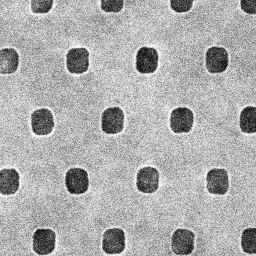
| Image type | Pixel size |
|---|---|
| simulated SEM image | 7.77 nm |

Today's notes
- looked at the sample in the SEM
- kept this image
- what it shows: a regular array of holes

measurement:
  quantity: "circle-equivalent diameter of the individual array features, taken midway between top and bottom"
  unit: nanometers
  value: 206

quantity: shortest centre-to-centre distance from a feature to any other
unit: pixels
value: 69